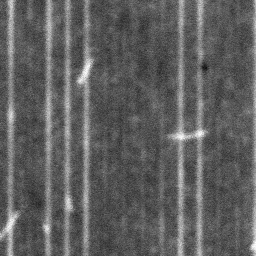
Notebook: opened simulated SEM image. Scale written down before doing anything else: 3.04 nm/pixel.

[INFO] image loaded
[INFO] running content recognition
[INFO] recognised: parallel lines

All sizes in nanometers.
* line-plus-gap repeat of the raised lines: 57.6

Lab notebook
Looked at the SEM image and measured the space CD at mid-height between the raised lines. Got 0.0494 um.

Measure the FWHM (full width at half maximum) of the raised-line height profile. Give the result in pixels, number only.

2.5